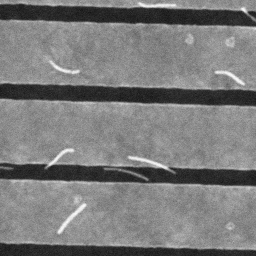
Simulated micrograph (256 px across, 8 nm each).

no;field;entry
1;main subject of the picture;lines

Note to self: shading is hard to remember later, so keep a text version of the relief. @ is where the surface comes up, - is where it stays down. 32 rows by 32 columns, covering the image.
----@@@@@@@@@@@@@@@@@@@@@@@@@@@@
--------------------------------
--------------------------------
@@@@@@@@@@@@@@@@@@@@@@@@@@@@@@@@
@@@@@@@@@@@@@@@@@@@@@@@@@@@@@@@@
@@@@@@@@@@@@@@@@@@@@@@@@@@@@@@@@
@@@@@@@@@@@@@@@@@@@@@@@@@@@@@@@@
@@@@@@@@@@@@@@@@@@@@@@@@@@@@@@@@
@@@@@@@@@@@@@@@@@@@@@@@@@@@@@@@@
@@@@@@@@@@@@@@@@@@@@@@@@@@@@@@@@
-------@@@@@@@@@@@@@@@@@@@@@@@@@
--------------------------------
@@------------------------------
@@@@@@@@@@@@@@@@@@@@@@@@@@@@@@@@
@@@@@@@@@@@@@@@@@@@@@@@@@@@@@@@@
@@@@@@@@@@@@@@@@@@@@@@@@@@@@@@@@
@@@@@@@@@@@@@@@@@@@@@@@@@@@@@@@@
@@@@@@@@@@@@@@@@@@@@@@@@@@@@@@@@
@@@@@@@@@@@@@@@@@@@@@@@@@@@@@@@@
@@@@@@@@@@@@@@@@@@@@@@@@@@@@@@@@
--@--@@@@@@@@@@@@@@@@@@@@@@@@@@@
--------------------------------
@-------------------------------
@@@@@@@@@@@@@@@@@@@@@@@@@@@@@@@@
@@@@@@@@@@@@@@@@@@@@@@@@@@@@@@@@
@@@@@@@@@@@@@@@@@@@@@@@@@@@@@@@@
@@@@@@@@@@@@@@@@@@@@@@@@@@@@@@@@
@@@@@@@@@@@@@@@@@@@@@@@@@@@@@@@@
@@@@@@@@@@@@@@@@@@@@@@@@@@@@@@@@
@@@@@@@@@@@@@@@@@@@@@@@@@@@@@@@@
------@-@@@@@@@@@@@@@@@@@@@@@@@@
--------------------------------